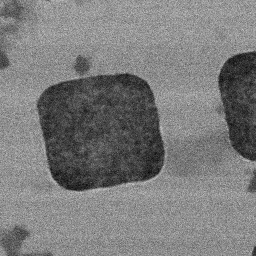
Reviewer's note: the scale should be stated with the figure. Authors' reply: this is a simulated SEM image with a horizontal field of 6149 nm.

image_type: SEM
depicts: holes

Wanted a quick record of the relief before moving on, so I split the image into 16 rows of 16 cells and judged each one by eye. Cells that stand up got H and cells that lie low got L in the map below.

HHHHHHHHHHHHHHHH
HHHHHHHHHHHHHHHH
HHHHHHHHHHHHHHHH
HHHHHHHHHHHHHHHL
HHHHHHHHHHHHHHLL
HHHLLLLLLHHHHHLL
HHLLLLLLLLHHHHLL
HHLLLLLLLLHHHHLL
HHHLLLLLLLHHHHLL
HHHLLLLLLLHHHHHL
HHHLLLLLLLHHHHHH
HHHHLLLLHHHHHHHH
HHHHHHHHHHHHHHHH
HHHHHHHHHHHHHHHH
HHHHHHHHHHHHHHHH
HHHHHHHHHHHHHHHH